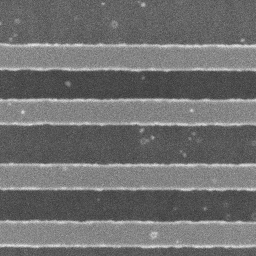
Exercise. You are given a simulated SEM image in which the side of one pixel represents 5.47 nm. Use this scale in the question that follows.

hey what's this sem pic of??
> lines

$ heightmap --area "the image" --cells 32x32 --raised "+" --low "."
................................
................................
................................
................................
................................
................................
++++++++++++++++++++++++++++++++
++++++++++++++++++++++++++++++++
++++++++++++++++++++++++++++++++
................................
................................
................................
++++++++++++++++++++++++.++.++++
++++++++++++++++++++++++++++++++
++++++++++++++++++++++++++++++++
++++++++++++++++++++++++++++++++
................................
................................
................................
................................
.+..............................
++++++++++++++++++++++++++++++++
++++++++++++++++++++++++++++++++
++++++++++++++++++++++++++++++++
................................
................................
................................
................................
++++++++++++++++++++++++++++++++
++++++++++++++++++++++++++++++++
++++++++++++++++++++++++++++++++
................................